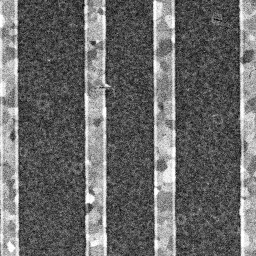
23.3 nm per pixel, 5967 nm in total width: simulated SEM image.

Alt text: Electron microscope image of one or a few lines or trenches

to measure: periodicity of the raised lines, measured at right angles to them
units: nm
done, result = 1810